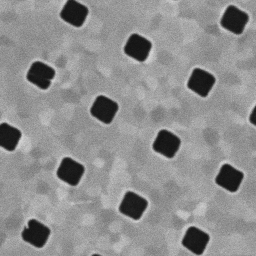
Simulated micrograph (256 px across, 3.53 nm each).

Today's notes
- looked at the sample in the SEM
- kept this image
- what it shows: a regular array of holes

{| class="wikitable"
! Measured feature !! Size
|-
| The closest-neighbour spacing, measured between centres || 249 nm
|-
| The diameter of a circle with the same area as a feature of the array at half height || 90.2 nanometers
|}